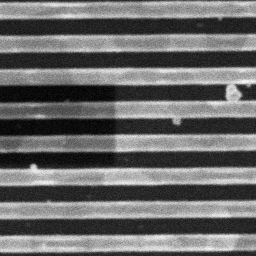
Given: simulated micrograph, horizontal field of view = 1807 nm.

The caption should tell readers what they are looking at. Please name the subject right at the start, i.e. wiring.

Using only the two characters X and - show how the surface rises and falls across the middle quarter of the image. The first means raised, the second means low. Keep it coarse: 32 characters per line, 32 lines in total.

--------------------------------
XXXXXXXXXXXXXXXXXXXXXXXXXXXXXXXX
XXXXXXXXXXXXXXXXXXXXXXXXXXXXXXXX
XXXXXXXXXXXXXXXXXXXXXXXXXXXXXXXX
XXXXXXXXXXXXXXXXXXXXXXXXXXXXXXXX
--------------------------------
--------------------------------
--------------------------------
--------------------------------
------------------------XXXXXXXX
XXXXXXXXXXXXXXXXXXXXXXXXXXXXXXXX
XXXXXXXXXXXXXXXXXXXXXXXXXXXXXXXX
XXXXXXXXXXXXXXXXXXXXXXXXXXXXXXXX
--------------------------------
--------------------------------
--------------------------------
--------------------------------
--------------------------------
XXXXXXXXXXXXXXXXXXXXXXXXXXXXXXXX
XXXXXXXXXXXXXXXXXXXXXXXXXXXXXXXX
XXXXXXXXXXXXXXXXXXXXXXXXXXXXXXXX
XXXXXXXXXXXXXXXXXXXXXXXXXXXXXXXX
--------------------------------
--------------------------------
--------------------------------
--------------------------------
XXXXXXXXXXXXXXXXXXXXXXXXXXXXXXXX
XXXXXXXXXXXXXXXXXXXXXXXXXXXXXXXX
XXXXXXXXXXXXXXXXXXXXXXXXXXXXXXXX
XXXXXXXXXXXXXXXXXXXXXXXXXXXXXXXX
--------------------------------
--------------------------------